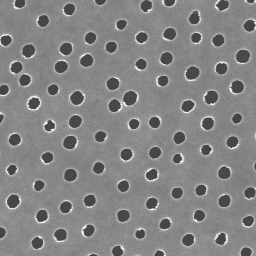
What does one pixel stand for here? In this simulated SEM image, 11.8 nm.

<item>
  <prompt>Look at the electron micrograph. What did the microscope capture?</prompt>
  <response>a regular array of holes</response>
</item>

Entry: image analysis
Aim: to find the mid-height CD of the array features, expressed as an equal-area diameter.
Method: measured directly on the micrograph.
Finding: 138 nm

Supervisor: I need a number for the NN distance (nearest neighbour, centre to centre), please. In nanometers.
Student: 290